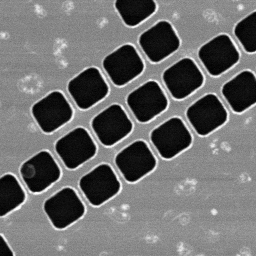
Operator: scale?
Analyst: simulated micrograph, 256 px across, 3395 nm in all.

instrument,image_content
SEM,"a regular array of holes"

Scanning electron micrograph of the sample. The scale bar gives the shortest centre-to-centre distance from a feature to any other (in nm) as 564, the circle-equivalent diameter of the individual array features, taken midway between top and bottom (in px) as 38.